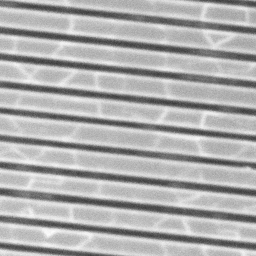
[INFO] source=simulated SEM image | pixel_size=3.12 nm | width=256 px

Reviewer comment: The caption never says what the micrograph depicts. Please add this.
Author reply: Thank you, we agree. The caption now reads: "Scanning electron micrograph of parallel lines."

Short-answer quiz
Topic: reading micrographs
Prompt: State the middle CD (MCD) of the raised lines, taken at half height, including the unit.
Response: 57.8 nm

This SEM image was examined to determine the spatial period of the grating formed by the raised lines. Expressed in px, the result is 26.8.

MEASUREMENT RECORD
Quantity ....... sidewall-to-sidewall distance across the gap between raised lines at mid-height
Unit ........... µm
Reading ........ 0.0248